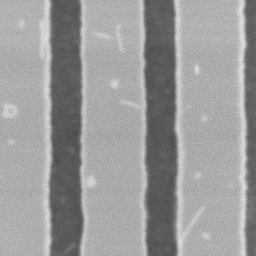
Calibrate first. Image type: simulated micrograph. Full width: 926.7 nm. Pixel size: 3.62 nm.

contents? lines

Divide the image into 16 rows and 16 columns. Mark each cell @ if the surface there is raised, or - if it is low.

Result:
@@@--@@@@--@@@@-
@@@--@@@@--@@@@-
@@@--@@@@--@@@@-
@@@--@@@@--@@@@-
@@@--@@@@--@@@@-
@@@--@@@@--@@@@-
@@@--@@@@--@@@@-
@@@--@@@@--@@@@-
@@@--@@@@--@@@@-
@@@--@@@@--@@@@-
@@@--@@@@--@@@@-
@@@--@@@@--@@@@-
@@@--@@@@--@@@@-
@@@--@@@@--@@@@-
@@@--@@@@--@@@@-
@@@--@@@@--@@@@-